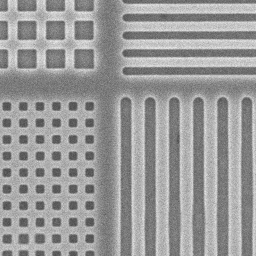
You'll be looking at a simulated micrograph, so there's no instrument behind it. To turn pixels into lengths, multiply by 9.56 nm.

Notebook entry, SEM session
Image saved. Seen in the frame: groups of lines, slits or small figures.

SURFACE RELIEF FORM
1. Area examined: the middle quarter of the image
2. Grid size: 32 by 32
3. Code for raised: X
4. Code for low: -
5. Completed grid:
XX------XXXXXXXX----------------
XXXXXXXXXXXXXX------------------
XXXXXXXXXXXXXXX-----------------
XXXXXXXXXXXXXXXXXXXXXXXXXXXXXXXX
XXXXXXXXXXXXXXXXXXXXXXXXXXXXXXXX
XXXXXXXXXXXXXXXXXXXXXXXXXXXXXXXX
XXXXXXXXXXXXXXXXXXXXXXXXXXXXXXXX
XXXXXXXXXXXXXXXXXXXXXXXXXXXXXXXX
XXXXXXXXXXXXXX--XXXXX-XXXXX--XXX
X--XX--XXXXXXX---XXX---XXX---XXX
X---X---XXXXXX---XXX---XXX---XXX
X--XX--XXXXXXX---XXX---XXX---XXX
XXXXXXXXXXXXXX---XXX---XXX---XXX
XXXXXXXXXXXXXX---XXX---XXX---XXX
X---X---XXXXXX---XXX---XXX---XXX
X--XX--XXXXXXX---XXX---XXX---XXX
XXXXXXXXXXXXXX---XXX---XXX---XXX
XXXXXXXXXXXXXX---XXX---XXX---XXX
X---X---XXXXXX---XXX---XXX---XXX
X---X---XXXXXX---XXX---XXX---XXX
XXXXXXXXXXXXXX---XXX---XXX---XXX
XXXXXXXXXXXXXX---XXX---XXX---XXX
X---X---XXXXXX---XXX---XXX---XXX
X---X---XXXXXX---XXX---XXX---XXX
XXXXXXXXXXXXXX---XXX---XXX---XXX
XXXXXXXXXXXXXX---XXX---XXX---XXX
X---X---XXXXXX---XXX---XXX---XXX
X---X---XXXXXX---XXX---XXX---XXX
XXXXXXXXXXXXXX---XXX---XXX---XXX
XXXXXXXXXXXXXX---XXX---XXX---XXX
X--XX--XXXXXXX---XXX---XXX---XXX
X---X---XXXXXX---XXX---XXX---XXX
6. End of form